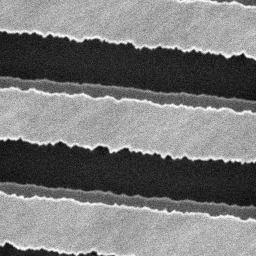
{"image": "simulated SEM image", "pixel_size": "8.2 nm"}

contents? lines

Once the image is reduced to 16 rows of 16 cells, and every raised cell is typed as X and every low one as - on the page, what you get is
XXXXXXXXXXXXXXXX
XXXXXXXXXXXXXXXX
------XXXXXXXXXX
---------------X
----------------
XXXXXXXX--------
XXXXXXXXXXXXXXXX
XXXXXXXXXXXXXXXX
XXXXXXXXXXXXXXXX
---------XXXXXXX
----------------
X---------------
XXXXXXXXXXX-----
XXXXXXXXXXXXXXXX
XXXXXXXXXXXXXXXX
-XXXXXXXXXXXXXXX